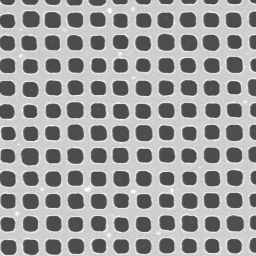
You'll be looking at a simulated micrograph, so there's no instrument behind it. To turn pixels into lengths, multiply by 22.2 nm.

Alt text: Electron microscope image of a regular array of holes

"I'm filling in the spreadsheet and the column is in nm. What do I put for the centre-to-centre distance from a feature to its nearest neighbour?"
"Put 489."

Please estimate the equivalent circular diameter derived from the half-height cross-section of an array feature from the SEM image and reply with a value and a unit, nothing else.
363 nanometres